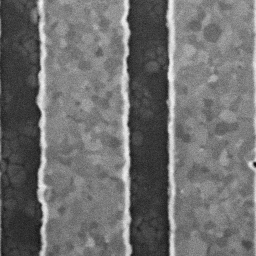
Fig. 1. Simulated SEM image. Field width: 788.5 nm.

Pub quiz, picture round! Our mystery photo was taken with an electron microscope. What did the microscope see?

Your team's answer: one or a few lines or trenches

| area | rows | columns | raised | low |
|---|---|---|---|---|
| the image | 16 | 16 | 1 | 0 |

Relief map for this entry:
0001111100011111
0001111100011111
0001111100011111
0001111100011111
0001111100011111
0001111100011111
0001111100011111
0001111100011111
0001111100011111
0001111100011111
0001111100011111
0001111100011111
0001111100011111
0001111100011111
0001111100011111
0001111100011111